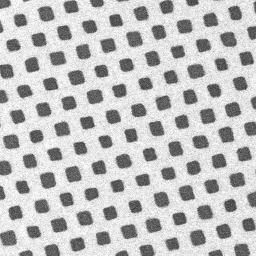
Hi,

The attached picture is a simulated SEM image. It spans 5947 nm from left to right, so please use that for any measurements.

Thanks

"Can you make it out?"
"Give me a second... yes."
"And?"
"a regular array of holes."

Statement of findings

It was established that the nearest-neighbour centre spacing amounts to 601 nanometers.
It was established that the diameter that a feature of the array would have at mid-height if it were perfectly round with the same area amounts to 348 nanometers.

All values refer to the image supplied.